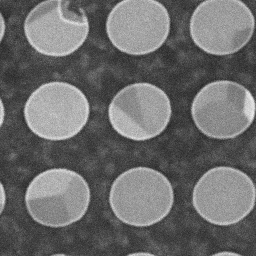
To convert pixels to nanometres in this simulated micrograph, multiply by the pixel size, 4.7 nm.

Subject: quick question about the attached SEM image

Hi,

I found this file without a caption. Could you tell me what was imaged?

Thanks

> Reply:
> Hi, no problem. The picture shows raised bodies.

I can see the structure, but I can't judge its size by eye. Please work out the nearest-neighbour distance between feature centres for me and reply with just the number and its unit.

392 nm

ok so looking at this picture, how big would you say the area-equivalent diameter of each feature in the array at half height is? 283 nm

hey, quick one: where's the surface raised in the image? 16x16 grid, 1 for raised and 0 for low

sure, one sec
0011000111001110
0011100111101111
0011100111001111
0000000000000000
0000000000000000
0001100011000110
0011100111101111
0011100111101111
0001000011000110
0000000000000000
0000000000000000
0011100111101111
0011110111101111
0011100111000110
0000000000000000
0000000000000000